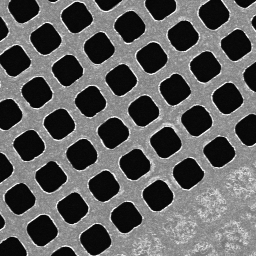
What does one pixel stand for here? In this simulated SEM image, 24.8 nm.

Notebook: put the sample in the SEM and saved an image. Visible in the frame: a regular array of holes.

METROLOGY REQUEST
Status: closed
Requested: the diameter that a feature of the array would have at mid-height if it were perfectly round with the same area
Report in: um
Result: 0.733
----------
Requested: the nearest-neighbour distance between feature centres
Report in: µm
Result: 0.936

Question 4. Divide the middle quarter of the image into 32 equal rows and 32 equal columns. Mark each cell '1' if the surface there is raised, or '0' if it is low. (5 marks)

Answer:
00001111111110001110000001111110
00000111111100000111000011111111
00000111111000000111111111101111
00001111110000000011111111000011
00011111110000000011111100000001
01111111111000000011111100000001
11111000011100000111111100000000
11110000011110011111111100000000
11100000001111111100001110000001
11100000001111111000001111000111
11100000001111110000000111111111
01110000001111110000000011111110
01111000111111110000000011111100
00111111111101111000000111111000
00011111110000011100001111111000
00011111100000011110111111111100
00011111000000001111111100011110
01111111000000001111111000001110
11111111100000001111110000000111
11100011110000011111110000000111
11000001110001111111110000000111
10000000111111111001111000000111
00000000111111110000111000011111
10000000111111000000011110111110
10000000111111000000011111111000
11000011111111000000001111110000
11100111111111000000011111100000
11111111000011100000111111100000
01111110000001110001111111110000
11111100000001111111110001110000
11111100000000111111100000111000
11111100000000111111000000011111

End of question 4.